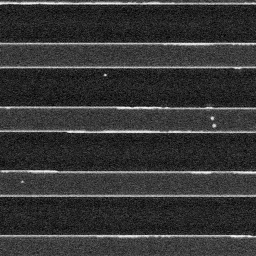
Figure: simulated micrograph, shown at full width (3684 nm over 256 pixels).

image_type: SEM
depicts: lines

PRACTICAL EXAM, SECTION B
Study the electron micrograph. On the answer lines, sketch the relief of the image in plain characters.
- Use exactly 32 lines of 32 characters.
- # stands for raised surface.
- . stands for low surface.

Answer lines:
................................
................................
................................
................................
................................
################################
################################
################################
.............................#..
................................
................................
................................
................................
#####################....##.....
################################
################################
........########################
................................
................................
................................
................................
########........................
################################
################################
................................
................................
................................
................................
................................
................................
################################
################################